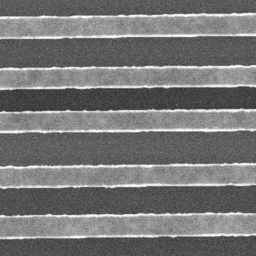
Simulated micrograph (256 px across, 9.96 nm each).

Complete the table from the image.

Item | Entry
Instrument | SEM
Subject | lines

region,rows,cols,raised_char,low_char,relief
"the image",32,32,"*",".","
................................
................................
********************************
********************************
*************************.......
................................
................................
................................
......**************************
********************************
********************************
................................
................................
................................
********************************
********************************
***..*..........................
................................
................................
................................
............................****
********************************
********************************
................................
................................
................................
................................
********************************
********************************
********************.*..........
................................
................................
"